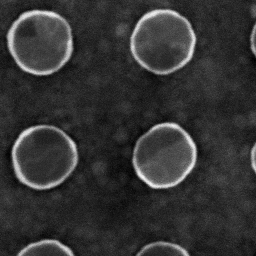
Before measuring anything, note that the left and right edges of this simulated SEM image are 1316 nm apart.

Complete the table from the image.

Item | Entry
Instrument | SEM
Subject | raised bodies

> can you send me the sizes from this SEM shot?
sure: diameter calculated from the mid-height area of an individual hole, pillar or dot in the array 323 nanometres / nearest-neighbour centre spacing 0.587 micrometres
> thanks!